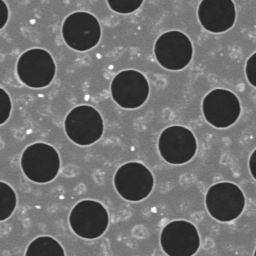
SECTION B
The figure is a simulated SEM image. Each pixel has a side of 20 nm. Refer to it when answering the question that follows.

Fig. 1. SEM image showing a regular array of holes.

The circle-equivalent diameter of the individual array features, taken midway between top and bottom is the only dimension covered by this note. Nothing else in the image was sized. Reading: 772 nm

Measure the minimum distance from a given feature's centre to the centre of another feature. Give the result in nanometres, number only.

1170